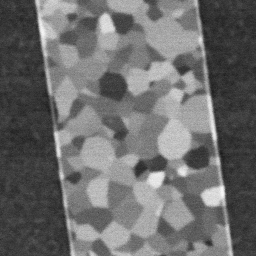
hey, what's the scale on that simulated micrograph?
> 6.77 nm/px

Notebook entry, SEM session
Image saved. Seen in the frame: one or a few lines or trenches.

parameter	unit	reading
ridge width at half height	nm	1070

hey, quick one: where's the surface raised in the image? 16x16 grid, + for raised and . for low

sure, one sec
..++++++++++....
..++++++++++....
...++++++++++...
...++++++++++...
...++++++++++...
...++++++++++...
...++++++++++...
...++++++++++...
...++++++++++...
....++++++++++..
....++++++++++..
....++++++++++..
....++++++++++..
....++++++++++..
....++++++++++..
....++++++++++..